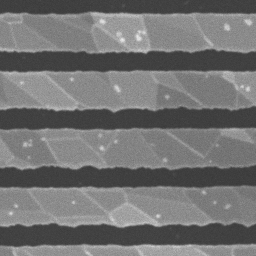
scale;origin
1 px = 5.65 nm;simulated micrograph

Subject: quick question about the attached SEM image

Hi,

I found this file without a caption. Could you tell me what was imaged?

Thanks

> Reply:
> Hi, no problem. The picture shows lines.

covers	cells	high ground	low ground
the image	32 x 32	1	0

00000000000000000000000000000000
00000000000000000000000000000000
11111111111111111111111111111111
11111111111111111111111111111111
11111111111111111111111111111111
11111111111111111111111111111111
00000000000111000100000000000010
00000000000000000000000000000000
00000000000000000000000000000000
11111111111111111111111111111111
11111111111111111111111111111111
11111111111111111111111111111111
11111111111111111111111111111111
10000011111111110111000010001100
00000000000000000000000000000000
00000000000000000000000000000000
11111111111111111111111111111111
11111111111111111111111111111111
11111111111111111111111111111111
11111111111111111111111111111111
11111111111111111111111111111111
00000000000000000000000000000000
00000000000000000000000000000000
11101010011100111111111111111111
11111111111111111111111111111111
11111111111111111111111111111111
11111111111111111111111111111111
11111111111111111111111111111111
00000000000000000000000000000000
00000000000000000000000000000000
00000000000000000000000000000000
11111111111111111111111111111111